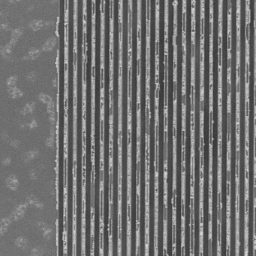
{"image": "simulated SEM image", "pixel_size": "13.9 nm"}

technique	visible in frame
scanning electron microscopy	parallel lines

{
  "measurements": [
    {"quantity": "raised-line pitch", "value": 126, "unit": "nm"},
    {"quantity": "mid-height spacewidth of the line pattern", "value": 5.25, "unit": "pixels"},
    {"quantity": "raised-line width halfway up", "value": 50.4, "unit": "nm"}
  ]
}